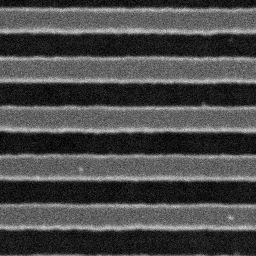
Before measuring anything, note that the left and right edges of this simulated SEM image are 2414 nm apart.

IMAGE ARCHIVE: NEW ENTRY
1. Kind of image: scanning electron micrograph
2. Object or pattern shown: lines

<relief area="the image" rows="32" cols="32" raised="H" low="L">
LLLLLLLLLLLLLLLLLLLLLLLLLLLLLLLL
HHHHHHHHHHHHHHHHHHHHHHHHHHHHHHHH
HHHHHHHHHHHHHHHHHHHHHHHHHHHHHHHH
HHHHHHHHHHHHHHHHHHHHHHHHHHHHHHHH
LLLLLLLLLLLLLLLLLLLLLLLLLLLLLLLL
LLLLLLLLLLLLLLLLLLLLLLLLLLLLLLLL
LLLLLLLLLLLLLLLLLLLLLLLLLLLLLLLL
HHHHHHHHHHHHHHHHHHHHHHHHHHHHHHHH
HHHHHHHHHHHHHHHHHHHHHHHHHHHHHHHH
HHHHHHHHHHHHHHHHHHHHHHHHHHHHHHHH
LLLLLLLLLLLLLLLLLLLLLLLLLLLLLLLL
LLLLLLLLLLLLLLLLLLLLLLLLLLLLLLLL
LLLLLLLLLLLLLLLLLLLLLLLLLLLLLLLL
HHHHHHHHHHHHHHHHHHHHHHHHHHHHHHHH
HHHHHHHHHHHHHHHHHHHHHHHHHHHHHHHH
HHHHHHHHHHHHHHHHHHHHHHHHHHHHHHHH
LLLLHLHHLLHHHHHLHLHLLLLLLLLLLLHH
LLLLLLLLLLLLLLLLLLLLLLLLLLLLLLLL
LLLLLLLLLLLLLLLLLLLLLLLLLLLLLLLL
HHHHHHHHHHHHHHHHHHHHHHHHHHHHHHHH
HHHHHHHHHHHHHHHHHHHHHHHHHHHHHHHH
HHHHHHHHHHHHHHHHHHHHHHHHHHHHHHHH
HHHHHHHHHHHHHHHHHHHHHHHHHHHHHHHH
LLLLLLLLLLLLLLLLLLLLLLLLLLLLLLLL
LLLLLLLLLLLLLLLLLLLLLLLLLLLLLLLL
LLLLLLLLLLLLLLLLLLLLLLLLLLLLLLLL
HHHHHHHHHHHHHHHHHHHHHHHHHHHHHHHH
HHHHHHHHHHHHHHHHHHHHHHHHHHHHHHHH
HHHHHHHHHHHHHHHHHHHHHHHHHHHHHHHH
LLLLLLLLLLLLLLLLLLLLLLLLLLLLLLLL
LLLLLLLLLLLLLLLLLLLLLLLLLLLLLLLL
LLLLLLLLLLLLLLLLLLLLLLLLLLLLLLLL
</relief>